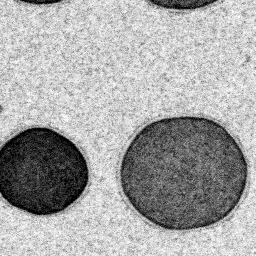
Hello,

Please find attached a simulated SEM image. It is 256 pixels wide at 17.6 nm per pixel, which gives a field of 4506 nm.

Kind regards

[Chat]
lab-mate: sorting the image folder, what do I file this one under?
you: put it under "holes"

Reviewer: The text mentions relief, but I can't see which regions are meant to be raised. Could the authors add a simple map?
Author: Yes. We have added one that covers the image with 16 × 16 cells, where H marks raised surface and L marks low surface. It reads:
HHHHHHHHHHLLHHHH
HHHHHHHHHHHHHHHH
HHHHHHHHHHHHHHHH
HHHHHHHHHHHHHHHH
HHHHHHHHHHHHHHHH
HHHHHHHHHHHHHHHH
HHHHHHHHHHHHHHHH
HHHHHHHHHHLLLHHH
HLLLHHHHLLLLLLHH
LLLLLHHHLLLLLLLH
LLLLLHHHLLLLLLLH
LLLLLHHHLLLLLLLH
LLLLLHHHLLLLLLLH
HHHHHHHHHLLLLLHH
HHHHHHHHHHHHHHHH
HHHHHHHHHHHHHHHH